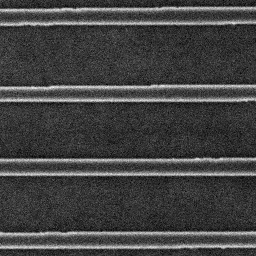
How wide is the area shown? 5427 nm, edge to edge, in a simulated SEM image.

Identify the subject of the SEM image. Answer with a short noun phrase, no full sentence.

lines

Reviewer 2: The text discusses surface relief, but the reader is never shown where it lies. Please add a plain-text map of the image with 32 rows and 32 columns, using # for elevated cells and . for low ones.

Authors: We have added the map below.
................................
################################
################################
................................
................................
................................
................................
................................
................................
................................
................................
################################
################################
................................
................................
................................
................................
................................
................................
................................
################################
################################
................................
................................
................................
................................
................................
................................
................................
################################
################################
................................